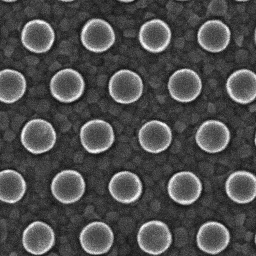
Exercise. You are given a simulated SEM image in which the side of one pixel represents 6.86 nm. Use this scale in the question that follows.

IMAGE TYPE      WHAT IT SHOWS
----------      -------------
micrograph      a regular array of raised bodies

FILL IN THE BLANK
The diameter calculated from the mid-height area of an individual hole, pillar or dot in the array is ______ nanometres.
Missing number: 223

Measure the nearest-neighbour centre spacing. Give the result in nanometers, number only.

393